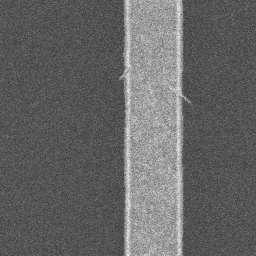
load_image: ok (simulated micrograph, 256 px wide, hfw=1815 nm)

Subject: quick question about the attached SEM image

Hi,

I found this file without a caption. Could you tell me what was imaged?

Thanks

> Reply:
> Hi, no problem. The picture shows one or a few lines or trenches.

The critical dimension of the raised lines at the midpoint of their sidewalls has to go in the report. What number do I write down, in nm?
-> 356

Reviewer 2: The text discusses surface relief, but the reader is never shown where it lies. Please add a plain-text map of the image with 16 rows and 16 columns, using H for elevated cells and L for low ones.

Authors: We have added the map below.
LLLLLLLLHHHLLLLL
LLLLLLLLHHHLLLLL
LLLLLLLLHHHLLLLL
LLLLLLLLHHHLLLLL
LLLLLLLLHHHLLLLL
LLLLLLLLHHHLLLLL
LLLLLLLLHHHLLLLL
LLLLLLLLHHHLLLLL
LLLLLLLLHHHLLLLL
LLLLLLLLHHHLLLLL
LLLLLLLLHHHLLLLL
LLLLLLLLHHHLLLLL
LLLLLLLLHHHLLLLL
LLLLLLLLHHHLLLLL
LLLLLLLLHHHLLLLL
LLLLLLLLHHHLLLLL